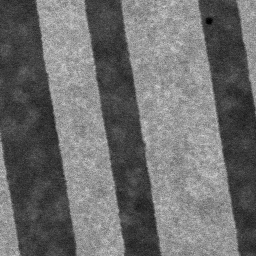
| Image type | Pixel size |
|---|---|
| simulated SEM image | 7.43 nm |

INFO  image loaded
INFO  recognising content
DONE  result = one or a few lines or trenches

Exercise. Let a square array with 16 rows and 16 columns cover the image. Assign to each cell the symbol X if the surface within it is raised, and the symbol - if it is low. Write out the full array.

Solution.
--XXX---XXXX---X
---XX---XXXXX--X
---XXX--XXXXX--X
---XXX--XXXXX--X
---XXX--XXXXX---
---XXX--XXXXX---
---XXX---XXXX---
---XXX---XXXXX--
----XXX--XXXXX--
----XXX--XXXXX--
----XXX--XXXXX--
X---XXX--XXXXX--
X---XXX---XXXX--
X---XXXX--XXXXX-
X----XXX--XXXXX-
X----XXX--XXXXX-